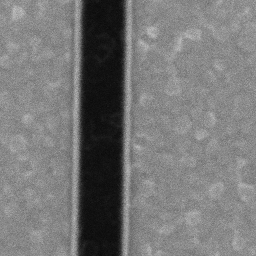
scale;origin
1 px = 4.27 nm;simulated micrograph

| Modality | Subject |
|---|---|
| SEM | one or a few lines or trenches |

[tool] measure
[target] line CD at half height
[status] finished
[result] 223 nm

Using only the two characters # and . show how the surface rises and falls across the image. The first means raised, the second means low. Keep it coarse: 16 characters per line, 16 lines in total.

.....###........
.....###........
.....###........
.....###........
.....###........
.....###........
.....###........
.....###........
.....###........
.....###........
.....###........
.....###........
.....###........
.....###........
.....###........
.....###........